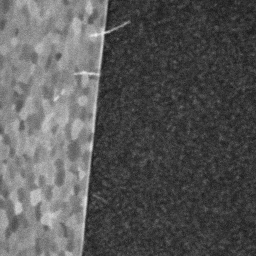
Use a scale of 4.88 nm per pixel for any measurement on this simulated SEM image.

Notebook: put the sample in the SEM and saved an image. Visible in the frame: one or a few lines or trenches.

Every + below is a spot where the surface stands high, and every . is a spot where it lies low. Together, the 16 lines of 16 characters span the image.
+++++++.........
+++++++.........
++++++..........
++++++..........
++++++..........
++++++..........
++++++..........
++++++..........
++++++..........
++++++..........
++++++..........
++++++..........
+++++...........
+++++...........
+++++...........
+++++...........